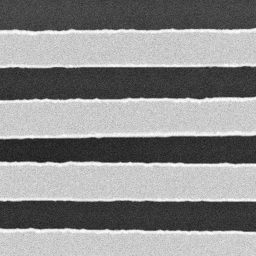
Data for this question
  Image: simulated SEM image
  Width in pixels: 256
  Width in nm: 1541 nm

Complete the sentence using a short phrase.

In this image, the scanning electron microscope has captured lines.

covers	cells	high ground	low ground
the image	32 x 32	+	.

................................
................................
................................
................................
++++++++++++++++++++++++++++++++
++++++++++++++++++++++++++++++++
++++++++++++++++++++++++++++++++
++++++++++++++++++++++++++++++++
................................
................................
................................
................................
....++...++++..+++++++++++++++++
++++++++++++++++++++++++++++++++
++++++++++++++++++++++++++++++++
++++++++++++++++++++++++++++++++
++++++++++++++++++++++++++++++++
................................
................................
................................
+++++++++++++++++++++++....++...
++++++++++++++++++++++++++++++++
++++++++++++++++++++++++++++++++
++++++++++++++++++++++++++++++++
++++++++++++++++++++++++++++++++
................................
................................
................................
................................
++++++++++++++++++++++++++++++++
++++++++++++++++++++++++++++++++
++++++++++++++++++++++++++++++++